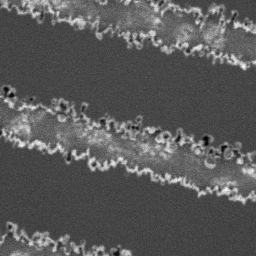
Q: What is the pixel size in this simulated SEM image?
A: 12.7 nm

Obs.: one or a few lines or trenches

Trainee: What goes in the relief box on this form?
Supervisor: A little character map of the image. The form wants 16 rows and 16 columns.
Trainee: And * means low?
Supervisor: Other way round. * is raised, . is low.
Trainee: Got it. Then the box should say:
*..........*****
******.........*
********.*......
**************..
****************
****************
.***************
.....***********
..........******
****.........***
********........
************....
****************
****************
****************
....************